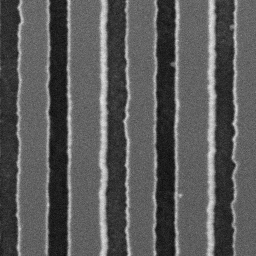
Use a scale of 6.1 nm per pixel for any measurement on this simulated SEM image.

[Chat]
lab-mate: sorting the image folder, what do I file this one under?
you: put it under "lines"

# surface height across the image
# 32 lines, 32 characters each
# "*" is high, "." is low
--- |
..****...****...****..*****..***
..****...****...****..*****..***
...***..*****...***...*****..***
..****...****...***...*****..***
..****...****...****..*****..***
..****...****...***...*****..***
..****...****...***...*****..***
..****...****...****..*****..***
..****..*****...****..*****..***
..****...****...***...*****..***
..****...****...***...*****..***
..****...****...***...*****..***
..****...****...****..*****..***
..****...****...****..*****..***
..****...****...***...*****..***
..****...****..****...*****..***
..****...****...***...*****..***
..****...****...***...*****..***
..****...****...***...*****..***
..****...****...****..*****..***
..****...****...****..*****..***
..****...****...***...*****..***
..****...****...****..*****..***
..****...****...***...*****..***
..****...****...***...*****..***
..****...****...****..*****..***
..****...****...***...*****..***
..****...****...***...*****..***
..****...****...***...****...***
..****...****...***...*****..***
..****...****...***...*****..***
..****...****...***...*****..***